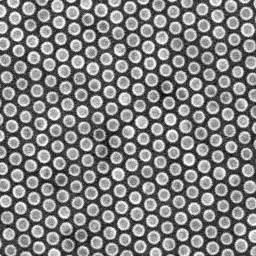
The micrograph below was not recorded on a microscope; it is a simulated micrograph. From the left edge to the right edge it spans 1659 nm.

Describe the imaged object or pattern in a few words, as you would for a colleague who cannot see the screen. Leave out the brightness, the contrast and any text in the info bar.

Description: a regular array of raised bodies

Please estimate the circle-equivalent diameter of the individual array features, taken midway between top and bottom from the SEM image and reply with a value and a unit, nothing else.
0.0723 µm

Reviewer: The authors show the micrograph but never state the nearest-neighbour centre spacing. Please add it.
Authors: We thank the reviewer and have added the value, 106 nm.